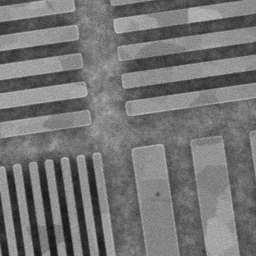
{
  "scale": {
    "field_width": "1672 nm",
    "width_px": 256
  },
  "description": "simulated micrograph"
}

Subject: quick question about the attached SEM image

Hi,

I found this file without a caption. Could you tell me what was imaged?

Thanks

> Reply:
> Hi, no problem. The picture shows groups of lines, slits or small figures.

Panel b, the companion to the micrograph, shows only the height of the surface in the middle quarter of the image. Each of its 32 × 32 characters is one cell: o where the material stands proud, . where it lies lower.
ooooo........................ooo
o.....................oooooooooo
................oooooooooooooooo
...............ooooooooooooooooo
...............ooooooooooo......
ooooo..........oooo.............
oooooo..........................
oooooo........................oo
oo....................oooooooooo
................oooooooooooooooo
................oooooooooooooooo
................ooooooooooo.....
ooooooo.........ooo.............
ooooooo.........................
ooooooo.........................
ooooo...........................
................................
................................
................................
................................
.....................oooo.......
.................oooooooo.......
........o........oooooooo.......
...oo..oo........oooooooo.......
o..oo..oo........oooooooo.......
o...o...o........oooooooo.......
oo..oo..oo........oooooooo......
oo..oo..oo........oooooooo......
oo..oo..oo........oooooooo......
oo..oo..oo........oooooooo......
oo..oo..oo........oooooooo......
oo..oo..oo........oooooooo......